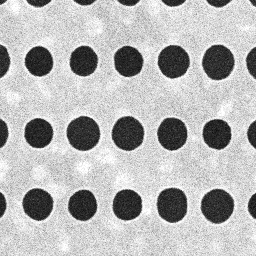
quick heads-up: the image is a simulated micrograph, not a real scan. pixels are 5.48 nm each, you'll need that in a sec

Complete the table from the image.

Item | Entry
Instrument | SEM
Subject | a regular array of holes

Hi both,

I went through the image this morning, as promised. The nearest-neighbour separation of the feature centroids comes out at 44.5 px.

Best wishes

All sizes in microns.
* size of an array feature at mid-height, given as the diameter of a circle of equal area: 0.175